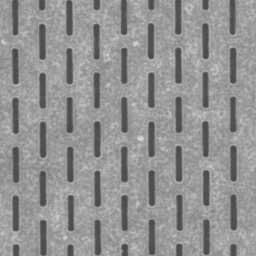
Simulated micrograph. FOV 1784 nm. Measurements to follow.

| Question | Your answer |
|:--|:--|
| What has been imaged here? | a regular array of holes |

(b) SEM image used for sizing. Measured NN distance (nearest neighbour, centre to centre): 251 nm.